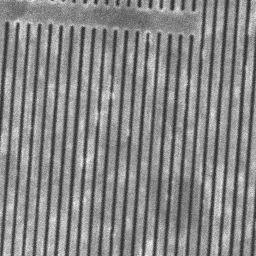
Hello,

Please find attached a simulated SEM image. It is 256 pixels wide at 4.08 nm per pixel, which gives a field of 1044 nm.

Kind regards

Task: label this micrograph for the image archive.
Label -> parallel lines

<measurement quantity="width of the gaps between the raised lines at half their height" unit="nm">18.3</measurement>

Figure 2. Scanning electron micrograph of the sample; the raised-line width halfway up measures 26.5 nanometers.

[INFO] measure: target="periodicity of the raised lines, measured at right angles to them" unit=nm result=44.5